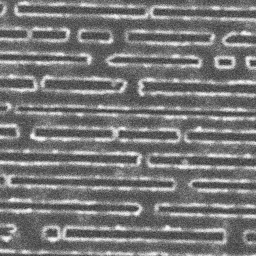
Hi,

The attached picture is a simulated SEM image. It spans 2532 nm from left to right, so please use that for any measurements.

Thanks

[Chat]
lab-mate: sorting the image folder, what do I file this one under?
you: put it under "parallel lines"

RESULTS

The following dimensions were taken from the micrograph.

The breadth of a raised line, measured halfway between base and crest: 164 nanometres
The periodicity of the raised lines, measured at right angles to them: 0.243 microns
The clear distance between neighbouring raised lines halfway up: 82.9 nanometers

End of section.